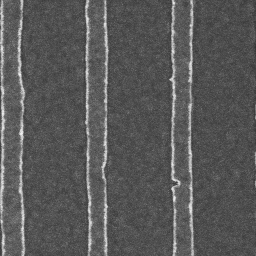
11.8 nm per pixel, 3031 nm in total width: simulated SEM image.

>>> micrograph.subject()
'one or a few lines or trenches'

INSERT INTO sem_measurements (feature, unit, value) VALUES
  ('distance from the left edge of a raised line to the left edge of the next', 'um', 1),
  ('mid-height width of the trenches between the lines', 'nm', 772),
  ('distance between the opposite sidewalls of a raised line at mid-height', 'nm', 235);